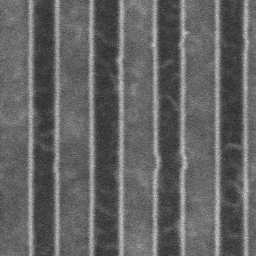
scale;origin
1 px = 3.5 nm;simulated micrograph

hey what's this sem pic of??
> one or a few lines or trenches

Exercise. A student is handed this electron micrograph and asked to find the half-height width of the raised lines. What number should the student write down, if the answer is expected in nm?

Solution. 104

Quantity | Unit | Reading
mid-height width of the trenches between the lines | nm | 117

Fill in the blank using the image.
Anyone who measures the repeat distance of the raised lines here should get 219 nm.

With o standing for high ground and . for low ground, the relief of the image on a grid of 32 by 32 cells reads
....ooo....oooo....oooo....oooo.
....ooo....oooo....oooo....oooo.
....ooo....oooo....oooo....oooo.
....ooo....oooo....oooo....oooo.
....ooo....oooo....oooo....oooo.
....ooo....oooo....oooo....oooo.
....ooo....oooo....oooo....oooo.
....ooo....oooo....oooo....oooo.
....ooo....oooo....oooo....oooo.
....ooo....oooo....oooo....oooo.
....ooo....oooo....oooo....oooo.
....ooo....oooo....oooo....oooo.
....ooo....oooo....oooo....oooo.
....ooo....oooo....oooo....oooo.
....ooo....oooo....oooo....oooo.
....ooo....oooo....oooo....oooo.
....ooo....oooo....oooo....oooo.
....ooo....oooo....oooo....oooo.
....ooo....oooo....oooo....oooo.
....ooo....oooo.....ooo....oooo.
....ooo.....ooo.....ooo....oooo.
....ooo....oooo....oooo....oooo.
....ooo....oooo....oooo....oooo.
....ooo....oooo....oooo....oooo.
....ooo....oooo....oooo....oooo.
....ooo....oooo....oooo....oooo.
....ooo....oooo....oooo....oooo.
....ooo....oooo....oooo....oooo.
....ooo....oooo....oooo....oooo.
....ooo....oooo....oooo....oooo.
....ooo....oooo....oooo....oooo.
....ooo....oooo....oooo....oooo.